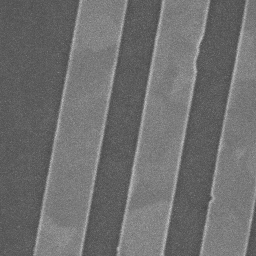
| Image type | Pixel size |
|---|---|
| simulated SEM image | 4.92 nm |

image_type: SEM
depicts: one or a few lines or trenches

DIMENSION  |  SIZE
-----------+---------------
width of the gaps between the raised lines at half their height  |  179 nm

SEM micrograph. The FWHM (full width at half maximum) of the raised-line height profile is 220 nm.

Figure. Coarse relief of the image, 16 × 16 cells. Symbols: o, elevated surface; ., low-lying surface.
.....ooo..ooo..o
.....ooo..ooo..o
.....oo...ooo..o
....ooo...oo...o
....ooo..ooo...o
....ooo..ooo..oo
....ooo..ooo..oo
....ooo..ooo..oo
...ooo...ooo..oo
...ooo...oo...oo
...ooo..ooo..ooo
...ooo..ooo..ooo
...ooo..ooo..ooo
...oo...ooo..ooo
..ooo...oo...ooo
..ooo..ooo...oo.